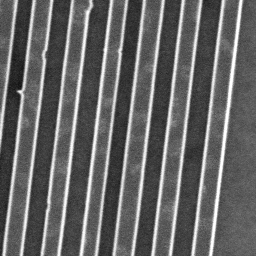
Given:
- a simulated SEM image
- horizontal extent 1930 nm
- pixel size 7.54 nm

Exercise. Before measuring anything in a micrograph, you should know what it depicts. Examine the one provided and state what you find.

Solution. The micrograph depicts parallel lines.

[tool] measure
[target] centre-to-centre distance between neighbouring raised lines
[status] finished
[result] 0.283 micrometres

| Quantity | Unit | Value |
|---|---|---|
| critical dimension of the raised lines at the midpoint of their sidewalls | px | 18.2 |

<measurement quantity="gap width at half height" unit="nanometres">145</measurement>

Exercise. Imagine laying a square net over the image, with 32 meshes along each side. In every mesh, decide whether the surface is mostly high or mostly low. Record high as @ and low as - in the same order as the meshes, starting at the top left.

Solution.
@@--@@@--@@---@@--@@---@@---@@--
@@--@@---@@---@@--@@---@@---@@--
@@--@@---@@---@@--@@---@@---@@--
@@--@@---@@---@---@@--@@@--@@@--
@@--@@--@@@--@@---@@--@@@--@@@--
@---@@--@@---@@--@@@--@@---@@---
@--@@@--@@---@@--@@@--@@---@@---
@--@@@--@@---@@--@@@--@@---@@---
@--@@---@@---@@--@@---@@---@@---
@--@@---@@---@@--@@---@@---@@---
@--@@---@@---@@--@@---@@---@@---
@--@@---@@---@---@@---@@--@@@---
@--@@---@@--@@---@@--@@@--@@@---
---@@--@@@--@@--@@@--@@@--@@----
--@@@--@@---@@--@@@--@@---@@----
--@@@--@@---@@--@@@--@@---@@----
--@@@--@@---@@--@@---@@---@@----
--@@---@@---@@--@@---@@---@@----
--@@---@@---@@--@@---@@---@@----
--@@---@@---@@--@@---@@--@@@----
--@@---@@--@@--@@@--@@@--@@@----
--@@--@@@--@@--@@@--@@@--@@@----
--@@--@@---@@--@@@--@@---@@-----
-@@@--@@---@@--@@@--@@---@@-----
-@@@--@@---@@--@@@--@@---@@-----
-@@@--@@---@@--@@---@@---@@-----
-@@---@@---@@--@@---@@---@@-----
-@@---@@---@@--@@---@@---@@-----
-@@---@@---@---@@--@@@--@@@-----
-@@--@@@--@@---@@--@@@--@@@-----
-@@--@@@--@@--@@@--@@@--@@@-----
-@@--@@---@@--@@@--@@---@@------